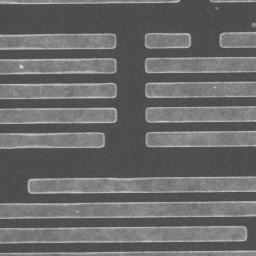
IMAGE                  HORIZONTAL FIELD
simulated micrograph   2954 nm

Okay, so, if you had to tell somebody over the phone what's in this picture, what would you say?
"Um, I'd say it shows groups of lines, slits or small figures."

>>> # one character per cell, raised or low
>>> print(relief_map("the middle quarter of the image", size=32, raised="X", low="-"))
XXXXXXXXXXXXX-------XXXXXXXXXXXX
XXXXXXXXXXXXX--------XXXXXXXXXXX
--------------------------------
--------------------------------
--------------------------------
XXXXXXXXXXXXX--------XXXXXXXXXXX
XXXXXXXXXXXXX--------XXXXXXXXXXX
XXXXXXXXXXXXX--------XXXXXXXXXXX
--------------------------------
--------------------------------
--------------------------------
XXXXXXXXXXXXX--------XXXXXXXXXXX
XXXXXXXXXXXXX--------XXXXXXXXXXX
XXXXXXXXXXXXX--------XXXXXXXXXXX
XXXXXXXXXXXX--------------------
--------------------------------
--------------------------------
XXXXXXXXXX-----------XXXXXXXXXXX
XXXXXXXXXX-----------XXXXXXXXXXX
XXXXXXXXXX-----------XXXXXXXXXXX
XXXXXXXXXX-----------XXXXXXXXXXX
--------------------------------
--------------------------------
--------------------------------
--------------------------------
--------------------------------
--------------------------------
--------------------------------
---------------------XXXXXXXXXXX
XXXXXXXXXXXXXXXXXXXXXXXXXXXXXXXX
XXXXXXXXXXXXXXXXXXXXXXXXXXXXXXXX
XXXXXXXXXXXXXXXXXXXXXXXXXXXXXXXX